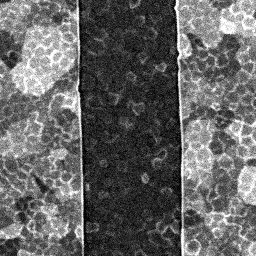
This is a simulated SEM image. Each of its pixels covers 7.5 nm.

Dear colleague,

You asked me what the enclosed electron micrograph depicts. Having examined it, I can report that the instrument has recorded one or a few lines or trenches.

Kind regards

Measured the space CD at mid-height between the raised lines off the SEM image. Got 750 nm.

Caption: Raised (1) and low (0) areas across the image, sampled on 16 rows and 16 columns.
1111100000011111
1111100000011111
1111100000011111
1111100000011111
1111100000011111
1111100000011111
1111100000011111
1111100000011111
1111100000011111
1111100000011111
1111100000011111
1111100000011111
1111100000011111
1111100000011111
1111100000011111
1111100000011111